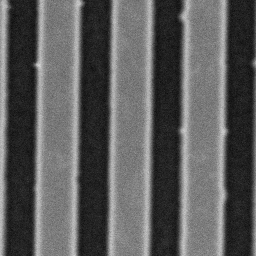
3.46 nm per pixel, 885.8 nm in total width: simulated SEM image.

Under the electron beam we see one or a few lines or trenches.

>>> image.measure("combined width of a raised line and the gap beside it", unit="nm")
252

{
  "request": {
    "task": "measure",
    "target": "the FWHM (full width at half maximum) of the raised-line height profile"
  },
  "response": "0.147 microns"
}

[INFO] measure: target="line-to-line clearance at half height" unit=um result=0.105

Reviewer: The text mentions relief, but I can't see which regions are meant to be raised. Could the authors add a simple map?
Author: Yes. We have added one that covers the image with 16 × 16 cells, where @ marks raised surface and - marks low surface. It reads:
--@@@--@@@-@@@--
--@@@--@@@-@@@--
--@@@--@@@-@@@--
--@@@--@@@-@@@--
--@@@--@@--@@@--
--@@@--@@--@@@--
--@@@--@@--@@@--
--@@@--@@--@@@--
--@@@--@@--@@@--
--@@@--@@--@@@--
--@@@--@@--@@@--
--@@@--@@--@@@--
--@@@--@@--@@@--
--@@@--@@--@@@--
--@@@--@@--@@@--
--@@@--@@--@@@--